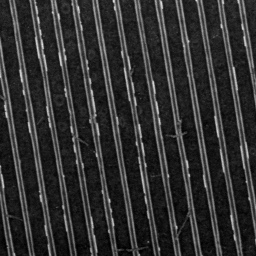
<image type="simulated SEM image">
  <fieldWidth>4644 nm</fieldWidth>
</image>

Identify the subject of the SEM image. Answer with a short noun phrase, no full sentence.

parallel lines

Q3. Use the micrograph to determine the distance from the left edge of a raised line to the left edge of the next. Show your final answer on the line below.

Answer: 373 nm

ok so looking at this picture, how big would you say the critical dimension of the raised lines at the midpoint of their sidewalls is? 89.5 nanometres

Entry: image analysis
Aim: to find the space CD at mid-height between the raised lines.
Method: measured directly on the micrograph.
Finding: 286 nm